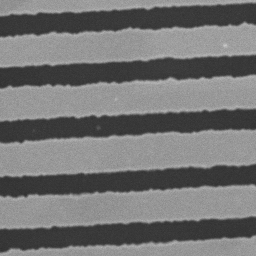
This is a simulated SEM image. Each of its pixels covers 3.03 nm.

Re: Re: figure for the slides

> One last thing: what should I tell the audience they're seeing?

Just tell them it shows lines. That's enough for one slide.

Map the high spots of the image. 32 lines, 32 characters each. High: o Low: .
ooooooooooooooooooooooooooooo...
oooooooo.o......................
................................
.....................oo.oooooooo
..oooooooooooooooooooooooooooooo
oooooooooooooooooooooooooooooooo
oooooooooooooooooooooooooooooooo
ooooooooooooooooooo.............
................................
...............................o
...........ooooooooooooooooooooo
oooooooooooooooooooooooooooooooo
oooooooooooooooooooooooooooooooo
oooooooooooooooooooooooooooooooo
ooooooooooo.o...................
................................
.....................o...ooooooo
.....ooooooooooooooooooooooooooo
oooooooooooooooooooooooooooooooo
oooooooooooooooooooooooooooooooo
oooooooooooooooooooooooooooooooo
oooooooooooooo..................
................................
.......................ooooooooo
...ooooooooooooooooooooooooooooo
oooooooooooooooooooooooooooooooo
oooooooooooooooooooooooooooooooo
ooooooooooooooooooooooooo.......
ooooo...........................
................................
.................ooooooooooooooo
.ooooooooooooooooooooooooooooooo